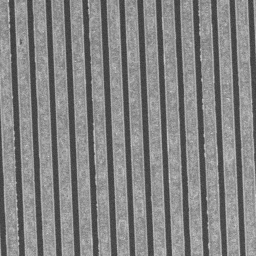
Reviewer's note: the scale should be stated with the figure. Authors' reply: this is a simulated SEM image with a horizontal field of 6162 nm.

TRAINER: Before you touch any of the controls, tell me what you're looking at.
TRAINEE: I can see parallel lines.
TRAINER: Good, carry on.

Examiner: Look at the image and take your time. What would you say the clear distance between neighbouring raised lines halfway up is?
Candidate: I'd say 165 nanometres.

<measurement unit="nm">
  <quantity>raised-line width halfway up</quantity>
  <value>268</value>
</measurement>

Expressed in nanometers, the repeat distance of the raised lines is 441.